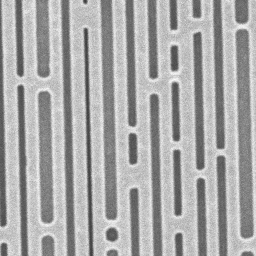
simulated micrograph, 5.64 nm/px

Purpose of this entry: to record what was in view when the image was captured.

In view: parallel lines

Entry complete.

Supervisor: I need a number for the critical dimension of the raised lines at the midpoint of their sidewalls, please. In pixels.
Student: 13.1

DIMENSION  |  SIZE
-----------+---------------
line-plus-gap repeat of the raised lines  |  0.124 micrometres